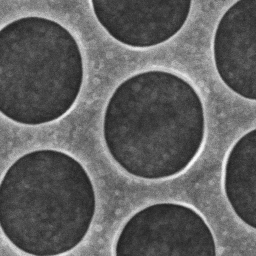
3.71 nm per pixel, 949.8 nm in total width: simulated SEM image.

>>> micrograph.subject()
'holes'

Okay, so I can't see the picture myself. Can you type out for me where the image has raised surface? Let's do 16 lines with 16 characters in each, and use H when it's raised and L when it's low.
HHHHHHLLLLLLHHLL
HLLLHHLLLLLHHHLL
LLLLLHHLLLHHHLLL
LLLLLHHHHHHHHLLL
LLLLLHHHHLHHHHLL
LLLLLHHLLLLLHHLL
LLLLLHHLLLLLLHHH
HLLHHHHLLLLLLHHH
HHHHHHHLLLLLLHHL
HHLLHHHLLLLLHHLL
HLLLLHHHLLLHHHLL
LLLLLLHHHHHHHHLL
LLLLLLHHHHHHHHLL
LLLLLLHHLLLLHHHL
LLLLLHHHLLLLLHHH
HLLLLHHLLLLLLHHH